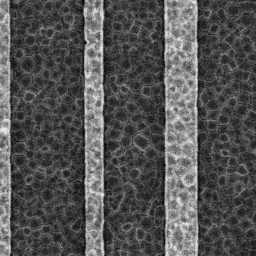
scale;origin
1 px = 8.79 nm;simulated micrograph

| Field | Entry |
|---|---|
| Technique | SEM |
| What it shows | one or a few lines or trenches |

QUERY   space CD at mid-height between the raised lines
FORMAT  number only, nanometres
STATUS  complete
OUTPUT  614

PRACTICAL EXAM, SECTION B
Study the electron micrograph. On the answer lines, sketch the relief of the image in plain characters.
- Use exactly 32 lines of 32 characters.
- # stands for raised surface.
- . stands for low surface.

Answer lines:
#..........##........###........
#..........##........####.......
#..........##........####.......
#..........##........###........
#..........##........###........
#..........##........###........
#..........##........####.......
#..........##........###........
#..........##........###........
#..........##........###........
#..........##........###........
#..........##........####.......
#..........##........####.......
#..........##........###........
#..........##........####.......
#..........##........####.......
#..........##........###........
#..........##........####.......
#..........##........####.......
#..........##........###........
#..........##........###........
#..........##........###........
#..........##........###........
#..........##........####.......
#..........##........####.......
#..........##........####.......
#..........##........####.......
#..........##........####.......
#..........##........####.......
#..........##........####.......
#..........##........####.......
#..........##........####.......